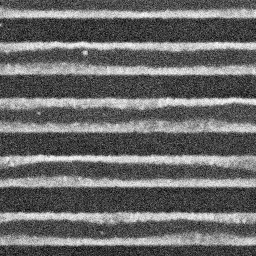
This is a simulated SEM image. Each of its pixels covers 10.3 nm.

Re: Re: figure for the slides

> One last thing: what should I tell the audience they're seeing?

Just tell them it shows lines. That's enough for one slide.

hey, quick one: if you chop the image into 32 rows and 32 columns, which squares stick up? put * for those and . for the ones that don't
********************************
********************************
................................
................................
................................
................................
********************************
********************************
********************************
................................
................................
................................
................................
********************************
********************************
********************************
................................
................................
................................
................................
********************************
********************************
********************************
................................
................................
................................
................................
********************************
********************************
********************************
................................
................................